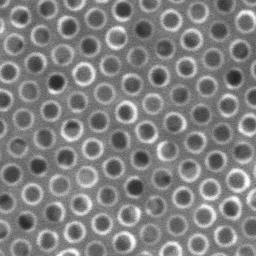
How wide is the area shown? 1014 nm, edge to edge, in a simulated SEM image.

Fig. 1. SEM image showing a regular array of raised bodies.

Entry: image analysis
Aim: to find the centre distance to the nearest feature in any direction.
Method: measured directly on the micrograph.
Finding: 28.1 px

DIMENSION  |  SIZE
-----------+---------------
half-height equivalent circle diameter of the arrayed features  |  81.7 nm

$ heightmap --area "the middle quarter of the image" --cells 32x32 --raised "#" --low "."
...####..#####...##....#....####
...####..#####........####..####
..######..###........#####...###
...####........####..#####......
#..####........####...####......
.........###...#####...##...##..
........####...####........####.
..###...#####...##.........####.
.#####..####........####...####.
.#####...###...#....#####..####.
.#####........####..#####.......
..###........#####..####........
.......###...#####........###...
......#####..#####.......#####..
####..#####....##...#....#####..
#####.#####.......#####..#####..
#####..###........#####...####..
####........####..#####........#
####.......#####...####.......##
.....####..######...##...##...##
.....#####..####........####..##
##...#####...##...##...#####...#
###..####........####...####....
###...##....#....#####..####....
###.......####...#####........##
##........#####..####........###
....####..#####........###...###
...#####..#####.......#####..###
#..#####....#...###...#####...##
#...####........####..#####.....
#....#.........#####...###......
#........####..#####........###.